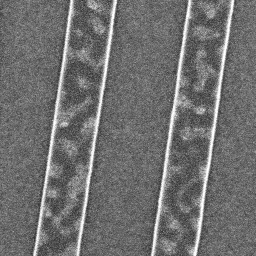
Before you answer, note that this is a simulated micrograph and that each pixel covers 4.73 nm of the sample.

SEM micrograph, one or a few lines or trenches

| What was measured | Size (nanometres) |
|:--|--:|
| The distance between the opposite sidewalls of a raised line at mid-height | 205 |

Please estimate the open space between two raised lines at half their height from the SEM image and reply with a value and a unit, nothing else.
72.7 pixels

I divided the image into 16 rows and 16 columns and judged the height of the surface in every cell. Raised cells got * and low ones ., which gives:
....***.....***.
....***.....**..
....***....***..
....***....***..
....***....***..
....**.....***..
....**.....***..
...***.....**...
...***.....**...
...***....***...
...***....***...
...***....***...
...**.....***...
..***.....***...
..***.....**....
..***.....**....